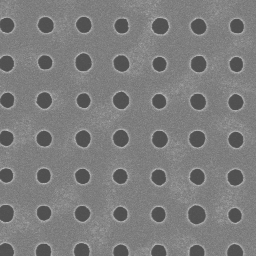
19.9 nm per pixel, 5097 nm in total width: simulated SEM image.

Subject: a regular array of holes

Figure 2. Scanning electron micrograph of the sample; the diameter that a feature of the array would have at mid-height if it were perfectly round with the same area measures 315 nanometers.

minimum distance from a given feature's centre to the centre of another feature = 747 nm